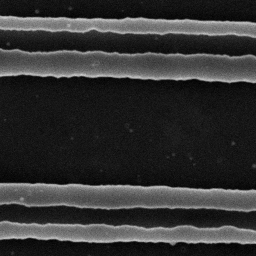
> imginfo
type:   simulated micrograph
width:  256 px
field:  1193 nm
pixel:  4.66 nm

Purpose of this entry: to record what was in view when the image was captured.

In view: lines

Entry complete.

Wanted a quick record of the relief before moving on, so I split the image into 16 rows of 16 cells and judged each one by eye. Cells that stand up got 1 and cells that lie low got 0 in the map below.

0000000000000000
1111111111111111
1111111111111111
1111111111111111
1111111111111111
0000000000000000
0000000000000000
0000000000000000
0000000000000000
0000000000000000
0000000000000000
1110000000000000
1111111111111111
1111111111111111
1111111111111111
0000000000000000